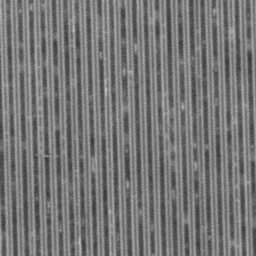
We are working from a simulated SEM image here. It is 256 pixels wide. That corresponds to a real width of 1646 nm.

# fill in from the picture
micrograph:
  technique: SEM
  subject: parallel lines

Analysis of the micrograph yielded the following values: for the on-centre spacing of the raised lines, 0.0735 micrometres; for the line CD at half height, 28.9 nanometres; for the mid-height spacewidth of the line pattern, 0.0458 um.